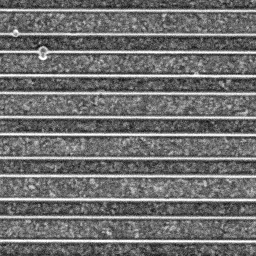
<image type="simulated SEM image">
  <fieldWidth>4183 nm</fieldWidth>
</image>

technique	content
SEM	parallel lines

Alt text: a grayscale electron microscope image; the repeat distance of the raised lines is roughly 41.4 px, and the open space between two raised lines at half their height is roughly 0.292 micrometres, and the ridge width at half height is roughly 0.39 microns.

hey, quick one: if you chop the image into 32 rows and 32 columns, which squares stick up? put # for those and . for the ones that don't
................................
################################
################################
################################
................................
................................
....##..........................
################################
################################
................................
................................
................................
################################
################################
################################
................................
................................
################################
################################
################################
................................
................................
################################
################################
################################
................................
................................
################################
################################
################################
................................
................................